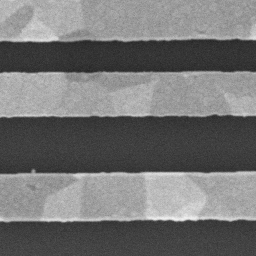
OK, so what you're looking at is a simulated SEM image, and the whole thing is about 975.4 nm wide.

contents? lines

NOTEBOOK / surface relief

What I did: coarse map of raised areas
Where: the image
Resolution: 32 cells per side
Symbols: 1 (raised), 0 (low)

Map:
11111111111111111111111111111111
11111111111111111111111111111111
11111111111111111111111111111111
11111111111111111111111111111111
11111111111111111111111111111111
00000000000000000000000000000000
00000000000000000000000000000000
00000000000000000000000000000000
00000000000000000000000000000000
11111111111111111111111111111111
11111111111111111111111111111111
11111111111111111111111111111111
11111111111111111111111111111111
11111111111111111111111111111111
11111101111111100000000001000010
00000000000000000000000000000000
00000000000000000000000000000000
00000000000000000000000000000000
00000000000000000000000000000000
00000000000000000000000000000000
00000000000000000000000000000000
00000000000000000000000000000000
11111111111111111111111111111111
11111111111111111111111111111111
11111111111111111111111111111111
11111111111111111111111111111111
11111111111111111111111111111111
11111111111110010000000000001000
00000000000000000000000000000000
00000000000000000000000000000000
00000000000000000000000000000000
00000000000000000000000000000000